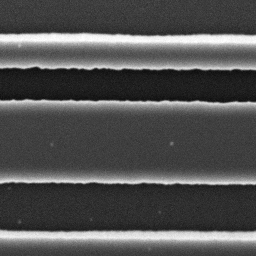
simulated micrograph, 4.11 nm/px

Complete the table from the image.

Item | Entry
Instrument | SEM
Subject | lines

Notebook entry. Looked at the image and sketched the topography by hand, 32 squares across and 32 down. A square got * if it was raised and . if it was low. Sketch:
................................
................................
................................
................................
................................
********************************
********************************
********************************
.....**.*.**.*******************
................................
................................
................................
................................
********************************
********************************
********************************
********************************
********************************
********************************
********************************
********************************
********************************
********************************
................................
................................
................................
................................
................................
................................
*************************.*.....
********************************
********************************